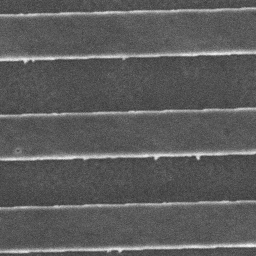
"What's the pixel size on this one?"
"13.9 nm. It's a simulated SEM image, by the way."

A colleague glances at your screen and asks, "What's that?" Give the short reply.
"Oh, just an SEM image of lines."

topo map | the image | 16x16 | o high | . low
................
oooooooooooooooo
oooooooooooooooo
oooooooooo......
................
................
................
oooooooooooooooo
oooooooooooooooo
oooooooooooooooo
................
................
................
oooooooooooooooo
oooooooooooooooo
ooooooooooo.....